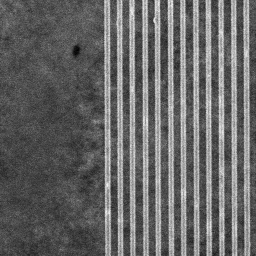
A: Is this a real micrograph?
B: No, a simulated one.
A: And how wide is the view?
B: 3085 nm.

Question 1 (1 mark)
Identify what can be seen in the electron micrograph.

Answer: parallel lines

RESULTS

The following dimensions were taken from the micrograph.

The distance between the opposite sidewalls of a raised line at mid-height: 0.0557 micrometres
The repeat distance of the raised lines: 152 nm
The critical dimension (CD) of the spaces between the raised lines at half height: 93.4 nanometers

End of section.